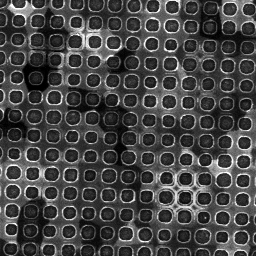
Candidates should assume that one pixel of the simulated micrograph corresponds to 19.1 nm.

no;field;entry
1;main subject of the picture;a regular array of holes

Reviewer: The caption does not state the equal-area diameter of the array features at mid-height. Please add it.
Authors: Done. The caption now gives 0.261 µm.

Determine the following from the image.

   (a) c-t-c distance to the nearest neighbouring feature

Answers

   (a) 0.36 micrometres